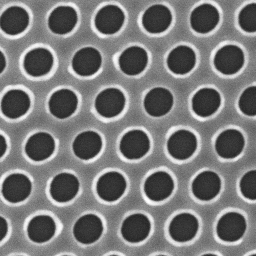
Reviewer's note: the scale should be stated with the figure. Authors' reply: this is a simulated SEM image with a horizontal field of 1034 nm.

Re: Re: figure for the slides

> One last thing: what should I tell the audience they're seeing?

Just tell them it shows a regular array of holes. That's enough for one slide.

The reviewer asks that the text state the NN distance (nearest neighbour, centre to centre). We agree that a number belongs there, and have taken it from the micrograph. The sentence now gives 191 nanometres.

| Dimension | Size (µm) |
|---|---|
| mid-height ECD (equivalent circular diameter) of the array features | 0.122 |